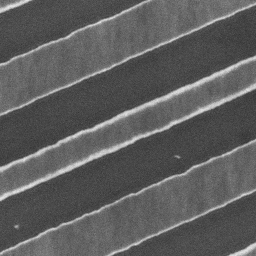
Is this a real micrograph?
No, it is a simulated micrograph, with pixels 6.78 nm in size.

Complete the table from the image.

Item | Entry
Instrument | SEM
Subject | lines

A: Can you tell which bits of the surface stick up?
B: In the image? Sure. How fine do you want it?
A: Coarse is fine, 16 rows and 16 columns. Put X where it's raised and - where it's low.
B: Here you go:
X-------XXXXXXX-
------XXXXXXX---
----XXXXXXX-----
-XXXXXXX--------
XXXXXX--------XX
XXXX-------XXXXX
XX-------XXXXX--
-------XXXXX----
----XXXXX-------
--XXXXX-------XX
XXXXX-------XXXX
XX--------XXXXXX
-------XXXXXXXX-
-----XXXXXXXX---
---XXXXXXX------
-XXXXXXX-------X